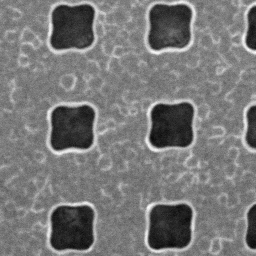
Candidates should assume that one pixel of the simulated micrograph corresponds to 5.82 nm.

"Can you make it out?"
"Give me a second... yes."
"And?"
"holes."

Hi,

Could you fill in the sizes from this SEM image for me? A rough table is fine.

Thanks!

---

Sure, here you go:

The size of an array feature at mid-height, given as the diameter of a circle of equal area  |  284 nm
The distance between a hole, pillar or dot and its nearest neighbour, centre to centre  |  571 nanometres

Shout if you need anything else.